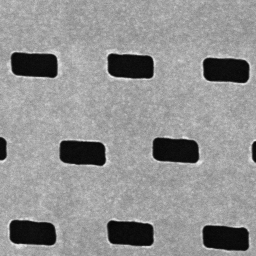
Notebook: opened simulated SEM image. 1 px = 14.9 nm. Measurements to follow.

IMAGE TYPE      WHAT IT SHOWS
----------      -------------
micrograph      a regular array of holes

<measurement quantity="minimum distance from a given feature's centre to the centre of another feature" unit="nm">1410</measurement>